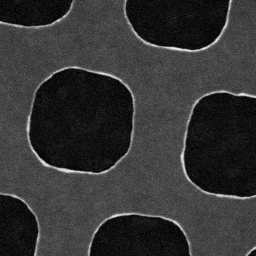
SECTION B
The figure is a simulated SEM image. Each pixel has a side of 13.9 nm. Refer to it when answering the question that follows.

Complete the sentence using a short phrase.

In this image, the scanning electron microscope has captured holes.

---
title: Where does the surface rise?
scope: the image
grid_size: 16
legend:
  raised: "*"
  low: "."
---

....****......**
*..*****......**
*********....***
****************
****..**********
**......********
**......****....
**......****....
**......****....
**......****....
****...*****....
************....
.***************
..******.*******
..****.....*****
..****......****